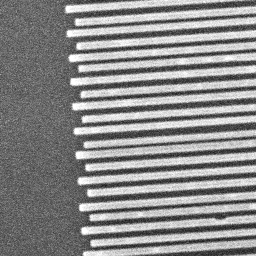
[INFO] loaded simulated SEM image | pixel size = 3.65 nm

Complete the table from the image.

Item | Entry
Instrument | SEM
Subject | parallel lines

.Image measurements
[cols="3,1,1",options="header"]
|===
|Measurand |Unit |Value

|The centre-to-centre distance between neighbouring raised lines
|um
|0.0448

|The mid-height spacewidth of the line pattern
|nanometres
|23.2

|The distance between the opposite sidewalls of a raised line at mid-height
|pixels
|6.22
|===